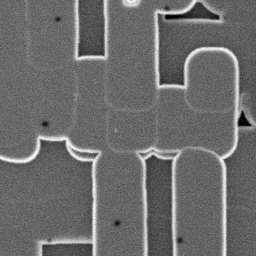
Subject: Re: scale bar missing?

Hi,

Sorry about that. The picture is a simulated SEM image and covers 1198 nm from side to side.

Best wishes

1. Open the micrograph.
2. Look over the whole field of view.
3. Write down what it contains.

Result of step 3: wiring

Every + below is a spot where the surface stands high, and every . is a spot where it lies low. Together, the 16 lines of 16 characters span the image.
+++++..+++++....
+++++..+++......
+++++..+++......
+++++.++++..+++.
++++++++++..+++.
+++++++++++++++.
+++++++++++++++.
+++++++++++++++.
+++++++++++++++.
++..++++++++++..
......+++..+++..
......+++..+++..
......+++..+++..
......+++..+++..
......+++..+++..
......+++..+++..